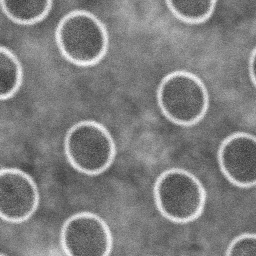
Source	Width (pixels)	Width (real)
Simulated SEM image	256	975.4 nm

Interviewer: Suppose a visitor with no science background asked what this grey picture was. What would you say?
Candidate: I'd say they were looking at raised bodies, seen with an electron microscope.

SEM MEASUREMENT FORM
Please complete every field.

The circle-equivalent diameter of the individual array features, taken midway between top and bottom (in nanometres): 186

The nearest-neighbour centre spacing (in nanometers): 379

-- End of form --